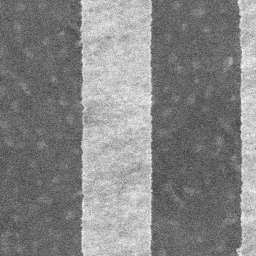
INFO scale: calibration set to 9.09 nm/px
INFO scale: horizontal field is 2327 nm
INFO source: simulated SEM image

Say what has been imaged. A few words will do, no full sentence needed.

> one or a few lines or trenches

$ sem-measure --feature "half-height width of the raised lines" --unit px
68.5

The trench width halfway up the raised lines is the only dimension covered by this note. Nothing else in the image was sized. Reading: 0.823 micrometres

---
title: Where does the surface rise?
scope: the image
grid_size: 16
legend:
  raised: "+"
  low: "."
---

.....++++......+
.....++++......+
.....++++......+
.....++++......+
.....++++......+
.....++++......+
.....++++......+
.....++++......+
.....++++......+
.....++++......+
.....++++......+
.....++++......+
.....++++......+
.....++++......+
.....++++......+
.....++++......+